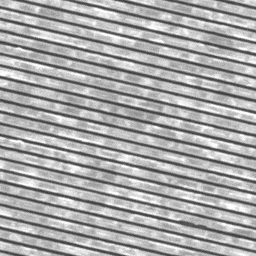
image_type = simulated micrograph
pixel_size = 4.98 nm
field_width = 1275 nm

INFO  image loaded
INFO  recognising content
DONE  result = parallel lines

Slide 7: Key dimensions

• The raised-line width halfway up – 38.3 nanometres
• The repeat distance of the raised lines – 56.4 nanometres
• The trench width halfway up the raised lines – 19.5 nm